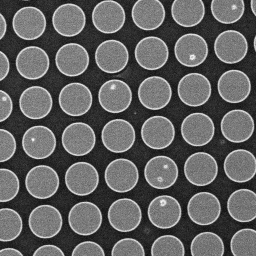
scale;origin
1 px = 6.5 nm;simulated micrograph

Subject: an array of small figures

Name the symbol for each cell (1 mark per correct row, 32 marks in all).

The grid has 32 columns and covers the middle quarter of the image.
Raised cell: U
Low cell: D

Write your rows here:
UUUUUUDDDUUUUUUDDDDUUUUUUDDDDDDU
UUUUUDDDDUUUUUDDDDDDDDDDDDDDDDDD
UUUUDDDDDDDDDDDDDDDDDDDDDDDDDDDU
DDDDDDDDDDDDDDDDDDDDDUUUUDDDDDUU
DDDDDDDDDDDUUUUDDDDDUUUUUUDDDUUU
UUUUUDDDDUUUUUUUDDDUUUUUUUDDDUUU
UUUUUUDDDUUUUUUUUDDUUUUUUUUDDUUU
UUUUUUUDDUUUUUUUUDDUUUUUUUUDDUUU
UUUUUUUDDUUUUUUUUDDUUUUUUUUDDUUU
UUUUUUUDDUUUUUUUUDDUUUUUUUDDDDUU
UUUUUUUDDUUUUUUUDDDDUUUUUDDDDDDD
UUUUUUDDDDUUUUUDDDDDDDDDDDDDDDDD
DUUUUDDDDDDDDDDDDDDDDDDDDDDDDDDD
DDDDDDDDDDDDDDDDDDDDDDUUUUDDDDUU
DDDDDDDDDDDUUUUUDDDDUUUUUUUDDDUU
DUUUUUDDDDUUUUUUUDDDUUUUUUUDDUUU
UUUUUUUDDDUUUUUUUUDUUUUUUUUUDUUU
UUUUUUUUDDUUUUUUUUDUUUUUUUUUDUUU
UUUUUUUUDUUUUUUUUUDUUUUUUUUDDDUU
UUUUUUUUDDUUUUUUUDDDUUUUUUUDDDDU
UUUUUUUUDDUUUUUUUDDDDUUUUUDDDDDD
UUUUUUUDDDDUUUUUDDDDDDDDDDDDDDDD
DDUUUDDDDDDDDDDDDDDDDDDDDDDDDDDD
DDDDDDDDDDDDDDDDDDDDDDUUUUDDDDDU
DDDDDDDDDDDDUUUUUDDDDUUUUUUUDDUU
DDUUUUUDDDDUUUUUUUDDUUUUUUUUDDUU
DUUUUUUUDDUUUUUUUUDDUUUUUUUUDDUU
DUUUUUUUDDUUUUUUUUDDUUUUUUUUDDUU
UUUUUUUUUDUUUUUUUUUDUUUUUUUUDDDU
UUUUUUUUUDDUUUUUUUDDDUUUUUUUDDDD
DUUUUUUUDDDUUUUUUUDDDDUUUUUDDDDD
DUUUUUUUDDDDUUUUUDDDDDDDDDDDDDDD